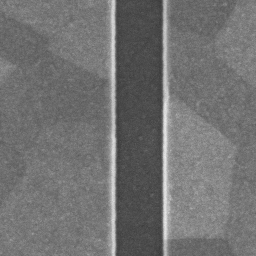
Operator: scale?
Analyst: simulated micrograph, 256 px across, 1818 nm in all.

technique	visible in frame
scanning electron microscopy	one or a few lines or trenches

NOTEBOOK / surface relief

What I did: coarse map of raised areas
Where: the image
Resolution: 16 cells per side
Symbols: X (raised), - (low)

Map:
XXXXXXX---XXXXXX
XXXXXXX---XXXXXX
XXXXXXX---XXXXXX
XXXXXXX---XXXXXX
XXXXXXX---XXXXXX
XXXXXXX---XXXXXX
XXXXXXX---XXXXXX
XXXXXXX---XXXXXX
XXXXXXX---XXXXXX
XXXXXXX---XXXXXX
XXXXXXX---XXXXXX
XXXXXXX---XXXXXX
XXXXXXX---XXXXXX
XXXXXXX---XXXXXX
XXXXXXX---XXXXXX
XXXXXXX---XXXXXX